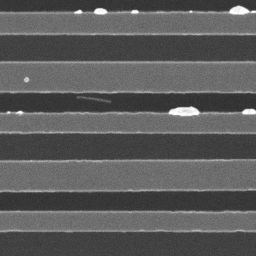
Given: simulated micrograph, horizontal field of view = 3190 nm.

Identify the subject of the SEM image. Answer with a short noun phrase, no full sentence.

lines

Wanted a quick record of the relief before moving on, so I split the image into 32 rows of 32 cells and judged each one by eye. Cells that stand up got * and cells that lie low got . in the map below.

................................
.........*****..**.....*....****
********************************
********************************
................................
................................
................................
................................
********************************
********************************
********************************
.**..***.**.***.**********.*****
................................
......................**........
********************************
********************************
********************************
................................
................................
................................
********************************
********************************
********************************
********************************
................................
................................
********************************
********************************
********************************
................................
................................
................................